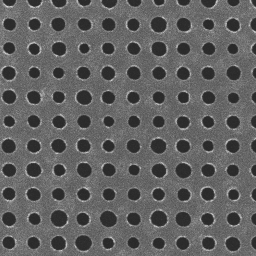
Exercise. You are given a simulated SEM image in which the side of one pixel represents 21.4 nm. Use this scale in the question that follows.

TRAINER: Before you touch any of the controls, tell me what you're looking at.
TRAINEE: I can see a regular array of holes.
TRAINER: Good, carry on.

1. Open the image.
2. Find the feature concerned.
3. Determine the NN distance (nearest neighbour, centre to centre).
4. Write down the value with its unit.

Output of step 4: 512 nm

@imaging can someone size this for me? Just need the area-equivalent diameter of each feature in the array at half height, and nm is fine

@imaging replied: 282